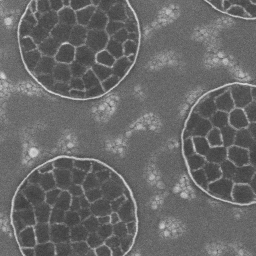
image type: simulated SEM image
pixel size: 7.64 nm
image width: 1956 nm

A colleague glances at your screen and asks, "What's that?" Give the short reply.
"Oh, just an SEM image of raised bodies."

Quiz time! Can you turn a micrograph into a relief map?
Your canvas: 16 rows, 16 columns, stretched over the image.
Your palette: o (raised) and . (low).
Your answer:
..oooooo.....ooo
.oooooooo.......
.oooooooo.......
.oooooooo.......
..oooooo........
...oooo.......oo
............oooo
............oooo
...........ooooo
...........ooooo
..ooooo.....oooo
.ooooooo....oooo
.ooooooo......oo
.oooooooo.......
.oooooooo.......
.ooooooo........